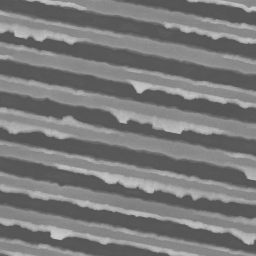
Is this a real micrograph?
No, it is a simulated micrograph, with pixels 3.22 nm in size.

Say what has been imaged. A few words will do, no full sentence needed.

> parallel lines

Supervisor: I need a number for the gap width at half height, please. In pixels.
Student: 14.6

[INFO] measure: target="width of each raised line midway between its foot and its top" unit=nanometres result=56.9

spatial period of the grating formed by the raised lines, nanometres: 102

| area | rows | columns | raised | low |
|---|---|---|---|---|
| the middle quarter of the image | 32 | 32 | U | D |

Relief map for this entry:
UUUUUUUUUUUUUUDDDDDDDDDDDDDDDDDD
UUUUUUUUUUUUUUUUUUUUDDDDDDDDDDDD
DDDUUUUUUUUUUUUUUUUUUUUUUDDDDDDD
DDDDDDDDDUUUUUUUUUUUUUUUUUUUUUDD
DDDDDDDDDDDDDUUUUUUUUUUUUUUUUUUU
DDDDDDDDDDDDDDDDDUUUUUUUUUUUUUUU
UUUDDDDDDDDDDDDDDDUUUUUUUUUUUUUU
UUUUUUUUUDDDDDDDDDDDDDDDDDDUUUUU
UUUUUUUUUUUUUUDDDDDDDDDDDDDDDDUU
UUUUUUUUUUUUUUUUUUUDDDDDDDDDDDDD
DDUUUUUUUUUUUUUUUUUUUUUUUDDDDDDD
DDDDDDDDDUUUUUUUUUUUUUUUUUUUUDDD
DDDDDDDDDDDDUUUUUUUUUUUUUUUUUUUU
UUDDDDDDDDDDDUUUUUUUUUUUUUUUUUUU
UUUUDDDDDDDDDDUUDDUUUUUUUUUUUUUU
UUUUUUUUDDDDDDDDDDDDDDUUUUUUUUUU
UUUUUUUUUUUUUDDDDDDDDDDUUUUUUUUU
UUUUUUUUUUUUUUUUUUUDDDDDDDDDDDDD
UDUUUUUUUUUUUUUUUUUUUUUDDDDDDDDD
DDDDDDDDUUUUUUUUUUUUUUUUUUUUUUDD
DDDDDDDDDDDDDUUUUUUUUUUUUUUUUUUU
DDDDDDDDDDDDDDDDDUUUUUUUUUUUUUUU
UDDDDDDDDDDDDDDDDDDDDDDDUUUUUUUU
UUUUUUUDDDDDDDDDDDDDDDDDDDDUUUUU
UUUUUUUUUUUUUDDDDDDDDDDDDDDDDDDD
UUUUUUUUUUUUUUUUUUDDDDDDDDDDDDDD
UUUUUUUUUUUUUUUUUUUUUUUDDDDDDDDD
DDDDDUUUUUUUUUUUUUUUUUUUUUUUDDDD
DDDDDDDDDUUUUUUUUUUUUUUUUUUUUUUU
DDDDDDDDDDUUUUUUUUUUUUUUUUUUUUUU
UUDDDDDDDDDDDDDUUUUUUUUUUUUUUUUU
UUUUUUUDDDDDDDDDDDDDUUUUUUUUUUUU